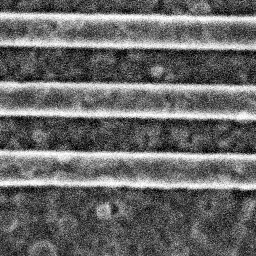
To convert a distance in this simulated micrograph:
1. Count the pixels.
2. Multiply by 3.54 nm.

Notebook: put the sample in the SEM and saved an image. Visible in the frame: one or a few lines or trenches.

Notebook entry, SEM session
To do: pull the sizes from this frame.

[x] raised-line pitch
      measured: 245 nm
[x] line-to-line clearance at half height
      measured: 0.134 micrometres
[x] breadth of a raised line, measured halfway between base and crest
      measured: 112 nm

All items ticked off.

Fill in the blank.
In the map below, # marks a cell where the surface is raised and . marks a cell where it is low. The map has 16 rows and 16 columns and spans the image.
................
################
################
................
................
################
################
................
................
#...............
################
################
................
................
................
................